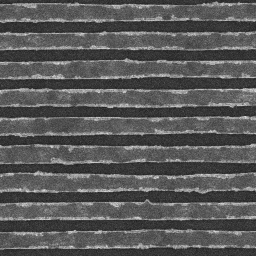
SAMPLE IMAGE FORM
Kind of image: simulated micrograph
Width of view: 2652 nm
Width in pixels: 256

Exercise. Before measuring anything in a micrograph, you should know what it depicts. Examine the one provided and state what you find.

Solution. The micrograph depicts parallel lines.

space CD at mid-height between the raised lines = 123 nm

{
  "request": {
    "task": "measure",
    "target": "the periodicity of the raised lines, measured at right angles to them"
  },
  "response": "28.4 pixels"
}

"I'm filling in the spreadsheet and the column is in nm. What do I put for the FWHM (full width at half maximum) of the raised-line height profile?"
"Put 175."